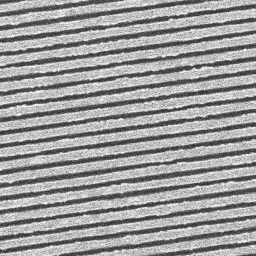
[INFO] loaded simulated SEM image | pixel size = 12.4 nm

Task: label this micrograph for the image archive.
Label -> parallel lines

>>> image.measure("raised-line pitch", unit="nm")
161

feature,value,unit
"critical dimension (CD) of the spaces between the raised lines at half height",56.8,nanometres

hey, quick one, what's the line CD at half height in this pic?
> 8.29 pixels